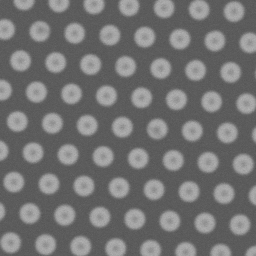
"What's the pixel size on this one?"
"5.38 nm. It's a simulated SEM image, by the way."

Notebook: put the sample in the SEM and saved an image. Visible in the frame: an array of small figures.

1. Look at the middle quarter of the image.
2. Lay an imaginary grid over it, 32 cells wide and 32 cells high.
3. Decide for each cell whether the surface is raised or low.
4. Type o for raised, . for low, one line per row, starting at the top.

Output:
....ooooo....ooooo....ooooo....o
.....oooo....ooooo....ooooo...oo
......o.......ooo.....oooo.....o
.......................oo......o
................................
ooo.............................
oooo.....oooo.....ooo......oo...
oooo....ooooo....ooooo....oooo..
oooo....ooooo....ooooo....ooooo.
ooo......oooo....ooooo....ooooo.
..................ooo.....oooo..
................................
................................
....oooo......oo................
...ooooo....ooooo.....ooo......o
...ooooo....ooooo....ooooo....oo
....oooo....ooooo....ooooo....oo
....ooo......oooo....ooooo....oo
......................ooo.....oo
................................
oo..............................
ooo.....oooo.....ooo............
oooo...ooooo....ooooo....oooo...
ooo....ooooo....ooooo....ooooo..
ooo.....oooo....ooooo....ooooo..
.........oo......ooo.....oooo...
...........................o....
................................
...oooo.........................
...oooo.....oooo.....ooo......oo
...oooo....ooooo....ooooo....ooo
...oooo....ooooo....ooooo....ooo